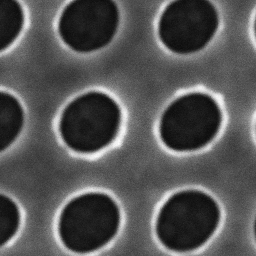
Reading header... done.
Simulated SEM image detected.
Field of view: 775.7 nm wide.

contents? holes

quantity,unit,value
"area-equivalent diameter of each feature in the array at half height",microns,0.183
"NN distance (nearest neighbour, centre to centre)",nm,298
